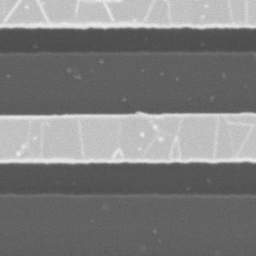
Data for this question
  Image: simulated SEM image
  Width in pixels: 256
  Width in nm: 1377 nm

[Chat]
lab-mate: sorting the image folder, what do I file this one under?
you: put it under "lines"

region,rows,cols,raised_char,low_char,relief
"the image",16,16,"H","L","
HHHHHHHHHHHHHHHH
HHHHHHHHHHHHHHHH
LLLLLLLLLLLLLLLL
LLLLLLLLLLLLLLLL
LLLLLLLLLLLLLLLL
LLLLLLLLLLLLLLLL
LLLLLLLLLLLLLLLL
HHHHHHHHHHHHHHHH
HHHHHHHHHHHHHHHH
HHHHHHHHHHHHHHHH
LLLLLLLLLLLLLLLL
LLLLLLLLLLLLLLLL
LLLLLLLLLLLLLLLL
LLLLLLLLLLLLLLLL
LLLLLLLLLLLLLLLL
LLLLLLLLLLLLLLLL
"